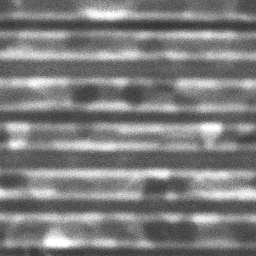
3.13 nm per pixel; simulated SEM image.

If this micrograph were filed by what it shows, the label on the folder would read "parallel lines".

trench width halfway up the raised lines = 56.3 nm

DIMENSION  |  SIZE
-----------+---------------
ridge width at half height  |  26.2 px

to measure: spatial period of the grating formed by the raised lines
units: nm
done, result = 145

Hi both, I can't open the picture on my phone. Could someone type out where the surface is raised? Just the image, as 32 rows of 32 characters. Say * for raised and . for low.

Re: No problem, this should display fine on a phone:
********************************
********************************
................................
................................
********************************
********************************
********************************
................................
................................
................................
********************************
********************************
********************************
********************************
................................
................................
********************************
********************************
..........********.........*****
................................
................................
*************..........**...***.
********************************
********************************
..******************************
................................
................................
********************************
********************************
********************************
********************************
................................